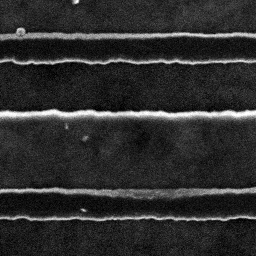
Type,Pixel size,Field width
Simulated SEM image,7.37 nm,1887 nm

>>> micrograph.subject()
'lines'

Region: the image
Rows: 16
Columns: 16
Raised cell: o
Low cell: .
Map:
oooooooooooooooo
oooooooooooooooo
oooooooooooooooo
oooooooooooooooo
................
................
................
oooooooooooooooo
oooooooooooooooo
oooooooooooooooo
oooooooooooooooo
oooooooooooooooo
oooooooooooooooo
oooooooooooooooo
................
................